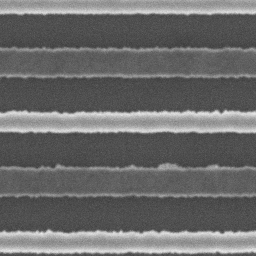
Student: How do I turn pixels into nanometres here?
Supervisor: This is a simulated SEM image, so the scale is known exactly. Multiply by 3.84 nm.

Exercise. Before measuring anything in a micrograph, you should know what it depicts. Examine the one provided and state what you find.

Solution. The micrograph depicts lines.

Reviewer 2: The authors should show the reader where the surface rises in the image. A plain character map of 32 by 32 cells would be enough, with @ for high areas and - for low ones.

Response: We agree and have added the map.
@@@@@@@@@@@@@@@@@@@@@@@@@@@@@@@@
@@@@@@@@@@@@@@@@@@@@@@@@@@@@@@@@
--------------------------------
--------------------------------
--------------------------------
--------------------------------
@@@@@@@@@@@@@@@@@@@@@@@@@@@@@@@@
@@@@@@@@@@@@@@@@@@@@@@@@@@@@@@@@
@@@@@@@@@@@@@@@@@@@@@@@@@@@@@@@@
@@@@@@@@@@@@@@@@@@@@@@@@@@@@@@@@
--------------------------------
--------------------------------
--------------------------------
--------------------------------
@@@@@@@@@@@@@@@@@@@@@@@@@@@@@@@@
@@@@@@@@@@@@@@@@@@@@@@@@@@@@@@@@
--@-@@@@@-@@@@--@@@@-@@-@@@@-@@@
--------------------------------
--------------------------------
--------------------------------
--------------------------------
@@@@@@@@@@@@@@@@@@@@@@@@@@@@@@@@
@@@@@@@@@@@@@@@@@@@@@@@@@@@@@@@@
@@@@@@@@@@@@@@@@@@@@@@@@@@@@@@@@
@@@@@@@@@@@@-@@@-@@@@@@@@@@@@@@@
--------------------------------
--------------------------------
--------------------------------
--------------------------------
@@@@@@@@@@@@@@@@@@@@@@@@@@@@@@@@
@@@@@@@@@@@@@@@@@@@@@@@@@@@@@@@@
@@@@@@@@@@@@@@@@@@@@@@@@@@@@@@@@